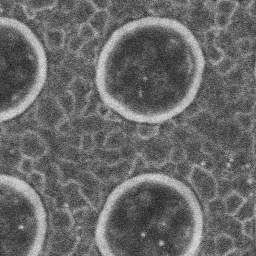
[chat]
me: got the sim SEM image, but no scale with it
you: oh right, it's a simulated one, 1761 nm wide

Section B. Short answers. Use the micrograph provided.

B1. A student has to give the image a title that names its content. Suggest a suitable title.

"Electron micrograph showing raised bodies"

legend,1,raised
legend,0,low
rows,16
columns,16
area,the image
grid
0000000000000000
1000000001100000
1100000111110000
1110001111110000
1110001111110000
1100001111110000
1100000111110000
0000000000000000
0000000000000000
0000000000000000
0000000000000000
1000000011100000
1100000111110000
1110001111110000
1110001111110000
1100001111110000